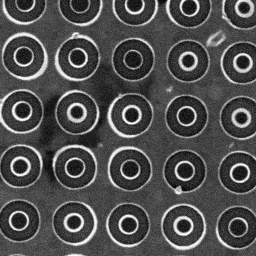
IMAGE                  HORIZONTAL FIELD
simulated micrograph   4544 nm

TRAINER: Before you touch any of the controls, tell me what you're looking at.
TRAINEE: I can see an array of small figures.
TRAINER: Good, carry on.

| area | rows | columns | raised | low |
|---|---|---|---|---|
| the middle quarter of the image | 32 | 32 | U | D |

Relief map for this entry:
DDDUDDDDUUUUDDDDUUUDDDUUUUDDDDUU
DDDDDDDDUUUUUDDDDDDDDDUUUUDDDDDD
DDDDDDDUUUUUUUDDDDDDDUUUUUUDDDDD
UDDDDDUUUUUUUUUDDDDDUUUUUUUUDDDD
UUUUUUUUUUUUUUUUUUUUUUUUUUUUUUDU
UUUUUUUUUUUUUUUUUUUUUUUUUUUUUUUU
UUUUUUUUUUUUUUUUUUUUUUUUUUUUUUUU
DDDDDUUUUUUUUUUUDDUUUUUUUUUUUUUU
DDDDDDDUUUUUUUDDDDDDUUUUUUUUDDDD
DDDDDDDDUUUUUDDDDDDDDUUUUUUDDDDD
DDUUDDDDUUUUDDDDDDDDDDUUUUDDDDDD
DUUUUDDDUUUUDDDUUUUDDDUUUUDDDUUU
DUUUUDDDUUUDDDDUUUUDDDUUUDDDDUUU
DDUUDDDDUUUDDDDUUUUDDDUUUDDDDUUU
DDDDDDDDUUUUDDDDUUDDDDUUUUDDDUUU
DDDDDDDUUUUUDDDDDDDDDUUUUUDDDDDD
DDDDDDUUUUUUUDDDDDDDUUUUUUUDDDDD
UUDUUUUUUUUUUUDDDDDUUUUUUUUUDDDD
UUUUUUUUUUUUUUUUUUUUUUUUUUUUUUUU
UUUUUUUUUUUUUUUUUUUUUUUUUUUUUUUU
UUDDUUUUUUUUUUUUUUUUUUUUUUUUUUUU
DDDDDDUUUUUUUUDDDDDUUUUUUUUUUUDU
DDDDDDDUUUUUDDDDDDDDUUUUUUUDDDDD
DDDDDDDDUUUUDDDDDDDDDUUUUUDDDDDD
DUUUUDDDUUUDDDDUUUDDDUUUUDDDDDDD
DUUUUDDDUUUDDDUUUUUDDDUUUDDDUUUU
DUUUUDDDUUUDDDUUUUUDDDUUUDDDUUUU
DUUUDDDDUUUDDDDUUUUDDDUUUDDDUUUU
DDDDDDDDUUUUDDDDDDDDDUUUUDDDDUUU
DDDDDDDUUUUUDDDDDDDDDUUUUUDDDDDD
DDDDDDUUUUUUUDDDDDDDUUUUUUUDDDDD
UUUUUUUUUUUUUUUDDDUUUUUUUUUUUDDD